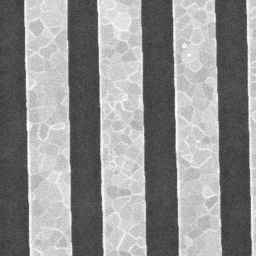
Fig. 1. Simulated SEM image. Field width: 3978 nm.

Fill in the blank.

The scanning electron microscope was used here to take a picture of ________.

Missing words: lines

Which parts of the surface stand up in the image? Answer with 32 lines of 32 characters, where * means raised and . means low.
...*****....******....*****....*
...*****....******....*****....*
...*****....******....*****....*
...*****....******....*****....*
...*****....******....*****....*
...*****....******....*****....*
...*****....******....*****....*
...*****....******....*****....*
...*****....******....*****....*
...*****.....*****....*****....*
...******....*****....*****....*
...******....*****....*****....*
...******....*****....*****....*
...******....*****....*****....*
...******....*****....*****....*
...******....*****....*****....*
...******....*****....*****....*
....*****....*****....*****....*
....*****....*****....*****....*
....*****....*****....*****....*
....*****....*****....*****....*
....*****....*****....*****....*
....*****....*****....*****....*
....*****....*****....*****....*
....*****....*****....*****....*
....*****....*****....*****....*
....*****....*****....*****....*
....*****....*****....******....
....*****....*****....******...*
....*****....*****....******...*
....*****....*****....******....
....*****....*****....******....